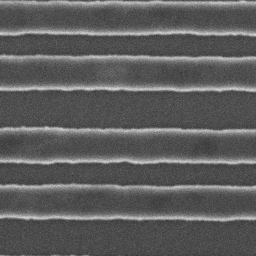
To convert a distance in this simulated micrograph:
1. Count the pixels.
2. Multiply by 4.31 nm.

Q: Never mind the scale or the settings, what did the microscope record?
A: lines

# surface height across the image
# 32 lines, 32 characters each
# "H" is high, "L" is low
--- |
HHHHHHHHHHHHHHHHHHHHHHHHHHHHHHHH
HHHHHHHHHHHHHHHHHHHHHHHHHHHHHHHH
HHHHHHHHHHHHHHHHHHHHHHHHHHHHHHHH
HHHHHHHHHHHHHHHHHHHHHHHHHHHHHHHH
LLLLLLLLLLLLLLLLLLLLLLLLLLLLLLLL
LLLLLLLLLLLLLLLLLLLLLLLLLLLLLLLL
LLLLLLLLLLLLLLLLLLLLLLLLLLLLLLLL
HHHHHHHHHHHHHHHHHHHHHHHHHHHHHHHH
HHHHHHHHHHHHHHHHHHHHHHHHHHHHHHHH
HHHHHHHHHHHHHHHHHHHHHHHHHHHHHHHH
HHHHHHHHHHHHHHHHHHHHHHHHHHHHHHHH
LLLLLLLLLLLLLLLLLLLLLLLLLLLLLLLL
LLLLLLLLLLLLLLLLLLLLLLLLLLLLLLLL
LLLLLLLLLLLLLLLLLLLLLLLLLLLLLLLL
LLLLLLLLLLLLLLLLLLLLLLLLLLLLLLLL
LLLLLLLLLLLLLLLLLLLLLLLLLLLLLLLL
HHHHHHHHHHHHHHHHHHHHHHHHHHHHHHHH
HHHHHHHHHHHHHHHHHHHHHHHHHHHHHHHH
HHHHHHHHHHHHHHHHHHHHHHHHHHHHHHHH
HHHHHHHHHHHHHHHHHHHHHHHHHHHHHHHH
LLLLLLLLLLLLLLLLLLLLLLLLLLLLLLLL
LLLLLLLLLLLLLLLLLLLLLLLLLLLLLLLL
LLLLLLLLLLLLLLLLLLLLLLLLLLLLLLLL
HHHHHHHHHHHHHHHHHHHHHHHHHHHHHHHH
HHHHHHHHHHHHHHHHHHHHHHHHHHHHHHHH
HHHHHHHHHHHHHHHHHHHHHHHHHHHHHHHH
HHHHHHHHHHHHHHHHHHHHHHHHHHHHHHHH
LLLLLLLLLLLLLLLLLLLLLLLLLLLHLLLL
LLLLLLLLLLLLLLLLLLLLLLLLLLLLLLLL
LLLLLLLLLLLLLLLLLLLLLLLLLLLLLLLL
LLLLLLLLLLLLLLLLLLLLLLLLLLLLLLLL
LLLLLLLLLLLLLLLLLLLLLLLLLLLLLLLL